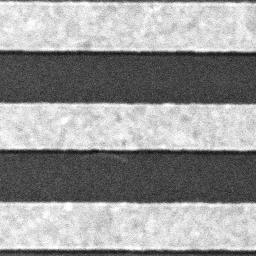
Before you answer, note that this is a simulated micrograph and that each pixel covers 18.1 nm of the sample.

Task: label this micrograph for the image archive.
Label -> lines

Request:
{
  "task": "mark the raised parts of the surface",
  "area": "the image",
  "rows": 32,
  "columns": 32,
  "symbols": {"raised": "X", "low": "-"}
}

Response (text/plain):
XXXXXXXXXXXXXXXXXXXXXXXXXXXXX-X-
XXXXXXXXXXXXXXXXXXXXXXXXXXXXXXXX
XXXXXXXXXXXXXXXXXXXXXXXXXXXXXXXX
XXXXXXXXXXXXXXXXXXXXXXXXXXXXXXXX
XXXXXXXXXXXXXXXXXXXXXXXXXXXXXXXX
XXXXXXXXXXXXXXXXXXXXXXXXXXXXXXXX
--------------------------------
--------------------------------
--------------------------------
--------------------------------
--------------------------------
--------------------------------
--------------------------------
XXXXXXXXXXXXXXXXXXXXXXXXXXXXXXXX
XXXXXXXXXXXXXXXXXXXXXXXXXXXXXXXX
XXXXXXXXXXXXXXXXXXXXXXXXXXXXXXXX
XXXXXXXXXXXXXXXXXXXXXXXXXXXXXXXX
XXXXXXXXXXXXXXXXXXXXXXXXXXXXXXXX
XXXXXXXXXXXXXXXXXXXXXXXXXXXXXXXX
--------------------------------
--------------------------------
--------------------------------
--------------------------------
--------------------------------
--------------------------------
XXXXXXXXXXXXXXXXX--X-XXXXX-X--XX
XXXXXXXXXXXXXXXXXXXXXXXXXXXXXXXX
XXXXXXXXXXXXXXXXXXXXXXXXXXXXXXXX
XXXXXXXXXXXXXXXXXXXXXXXXXXXXXXXX
XXXXXXXXXXXXXXXXXXXXXXXXXXXXXXXX
XXXXXXXXXXXXXXXXXXXXXXXXXXXXXXXX
--------------------------------